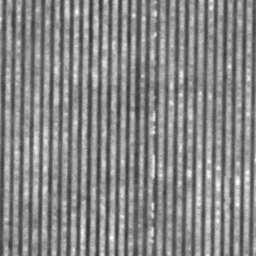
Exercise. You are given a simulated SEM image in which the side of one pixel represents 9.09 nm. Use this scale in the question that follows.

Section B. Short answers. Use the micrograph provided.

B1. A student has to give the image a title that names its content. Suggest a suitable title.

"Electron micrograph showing parallel lines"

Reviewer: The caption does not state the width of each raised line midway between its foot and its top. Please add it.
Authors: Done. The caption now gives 47.7 nm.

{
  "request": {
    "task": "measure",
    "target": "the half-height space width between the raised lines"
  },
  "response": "4.38 pixels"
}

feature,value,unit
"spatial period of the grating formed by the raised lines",0.0874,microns